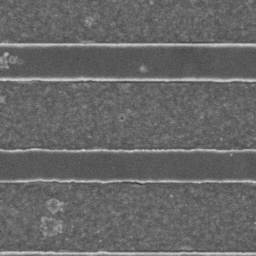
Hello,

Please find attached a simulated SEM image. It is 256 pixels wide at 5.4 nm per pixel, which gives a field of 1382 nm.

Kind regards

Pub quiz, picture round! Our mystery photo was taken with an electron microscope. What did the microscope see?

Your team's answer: lines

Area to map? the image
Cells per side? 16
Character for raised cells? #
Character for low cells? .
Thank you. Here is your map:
................
................
................
################
################
................
................
................
................
################
################
................
................
................
................
................